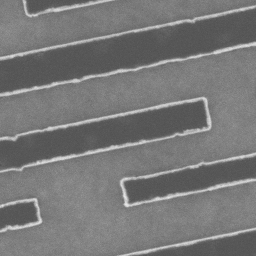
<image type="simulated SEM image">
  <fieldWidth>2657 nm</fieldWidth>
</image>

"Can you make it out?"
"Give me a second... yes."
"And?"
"one or a few lines or trenches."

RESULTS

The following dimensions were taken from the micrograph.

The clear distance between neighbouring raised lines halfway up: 41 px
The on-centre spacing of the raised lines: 746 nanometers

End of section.